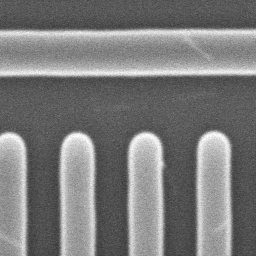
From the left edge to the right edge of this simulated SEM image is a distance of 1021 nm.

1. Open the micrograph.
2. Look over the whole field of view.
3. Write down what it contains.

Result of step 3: groups of lines, slits or small figures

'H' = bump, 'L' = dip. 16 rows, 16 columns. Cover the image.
LLLLLLLLLLLLLLLL
LLLLLLLLLLLLLLLL
HHHHHHHHHHHHHHHH
HHHHHHHHHHHHHHHH
HHHHHHHHHHHHHHHH
LLLLLLLLLLLLLLLL
LLLLLLLLLLLLLLLL
LLLLLLLLLLLLLLLL
HLLLLLLLLLLLLHLL
HLLLHHLLHHLLHHLL
HHLLHHLLHHLLHHLL
HHLLHHLLHHLLHHLL
HHLLHHLLHHLLHHLL
HHLLHHLLHHLLHHLL
HHLLHHLLHHLLHHLL
HHLLHHLLHHLLHHLL